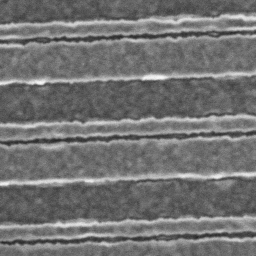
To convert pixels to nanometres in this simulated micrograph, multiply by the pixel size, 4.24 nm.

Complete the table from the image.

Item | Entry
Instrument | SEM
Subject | lines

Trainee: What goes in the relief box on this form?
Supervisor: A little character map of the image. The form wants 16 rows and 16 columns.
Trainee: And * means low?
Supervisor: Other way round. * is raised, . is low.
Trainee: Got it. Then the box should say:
................
...*************
****************
****************
****************
................
................
.........*******
****************
****************
****************
**..............
................
................
****************
****************